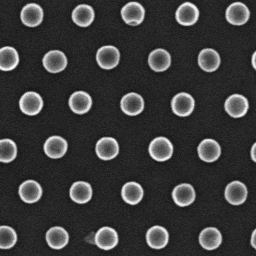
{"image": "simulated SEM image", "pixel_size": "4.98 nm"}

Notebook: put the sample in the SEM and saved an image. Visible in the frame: a regular array of raised bodies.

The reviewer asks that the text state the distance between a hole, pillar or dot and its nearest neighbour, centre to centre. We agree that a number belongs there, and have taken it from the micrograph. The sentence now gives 249 nm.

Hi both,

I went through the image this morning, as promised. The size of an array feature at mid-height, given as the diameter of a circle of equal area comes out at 112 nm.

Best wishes